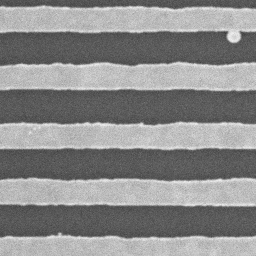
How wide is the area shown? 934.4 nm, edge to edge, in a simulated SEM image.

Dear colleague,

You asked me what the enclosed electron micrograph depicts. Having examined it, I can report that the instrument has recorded lines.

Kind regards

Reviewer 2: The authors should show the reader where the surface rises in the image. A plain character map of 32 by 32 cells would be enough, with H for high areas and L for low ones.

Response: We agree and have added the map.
LLLLLLLLLLLLLLLLLLLLLLLLLLLLLLLL
HHHHHHHHHHHHHHHHHHHHHHHHHHHHHHHH
HHHHHHHHHHHHHHHHHHHHHHHHHHHHHHHH
HHHHHHHHHHHHHHHHHHHHHHHHHHHHHHHH
LLLLLLLLLLLLLLLLLLLLLLLLLLLLLHLL
LLLLLLLLLLLLLLLLLLLLLLLLLLLLLLLL
LLLLLLLLLLLLLLLLLLLLLLLLLLLLLLLL
LLLLLLLLLLLLLLLLLLLLLLLLLLLLLLLL
HHHHHHHHHHHHHHHHHHHHHHHHHHHHHHHH
HHHHHHHHHHHHHHHHHHHHHHHHHHHHHHHH
HHHHHHHHHHHHHHHHHHHHHHHHHHHHHHHH
LLLLLLLLLLLLLLLLLLLLLLLLLLLLLLLL
LLLLLLLLLLLLLLLLLLLLLLLLLLLLLLLL
LLLLLLLLLLLLLLLLLLLLLLLLLLLLLLLL
LLLLLLLLLLLLLLLLLLLLLLLLLLLLLLLL
HHHHHHHLLHHHHHLLLLLLLHHHHHHHHHHL
HHHHHHHHHHHHHHHHHHHHHHHHHHHHHHHH
HHHHHHHHHHHHHHHHHHHHHHHHHHHHHHHH
HHHHHHHHLHHHHLLHHLHHHHHHHHLHHHHH
LLLLLLLLLLLLLLLLLLLLLLLLLLLLLLLL
LLLLLLLLLLLLLLLLLLLLLLLLLLLLLLLL
LLLLLLLLLLLLLLLLLLLLLLLLLLLLLLLL
LHHHHHHLLLLLHHHHHHLLLLLLLLLHHHHH
HHHHHHHHHHHHHHHHHHHHHHHHHHHHHHHH
HHHHHHHHHHHHHHHHHHHHHHHHHHHHHHHH
LLHHHHLLHHHHLHHHHHHHHHHHHHHHHHHH
LLLLLLLLLLLLLLLLLLLLLLLLLLLLLLLL
LLLLLLLLLLLLLLLLLLLLLLLLLLLLLLLL
LLLLLLLLLLLLLLLLLLLLLLLLLLLLLLLL
LLLLLLHHHLLLLLLLLLLLLLLLLLLLLLLL
HHHHHHHHHHHHHHHHHHHHHHHHHHHHHHHH
HHHHHHHHHHHHHHHHHHHHHHHHHHHHHHHH